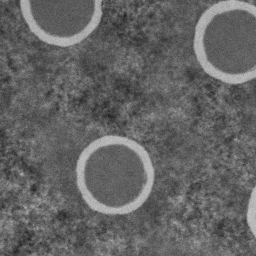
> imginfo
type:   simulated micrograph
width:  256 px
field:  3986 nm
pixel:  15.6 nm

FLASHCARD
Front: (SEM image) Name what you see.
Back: raised bodies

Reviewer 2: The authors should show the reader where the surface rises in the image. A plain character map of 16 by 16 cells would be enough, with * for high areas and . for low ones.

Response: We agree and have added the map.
..****........**
..****.......***
...**.......****
.............***
.............***
................
................
................
................
.....****.......
.....****.......
.....****.......
......***.......
................
................
................